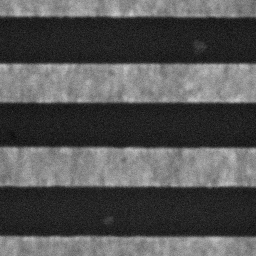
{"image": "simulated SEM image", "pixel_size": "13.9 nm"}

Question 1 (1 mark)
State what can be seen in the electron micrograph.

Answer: lines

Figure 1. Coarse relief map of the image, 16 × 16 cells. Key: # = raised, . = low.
################
................
................
................
################
################
................
................
................
################
################
################
................
................
................
################